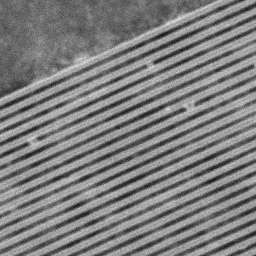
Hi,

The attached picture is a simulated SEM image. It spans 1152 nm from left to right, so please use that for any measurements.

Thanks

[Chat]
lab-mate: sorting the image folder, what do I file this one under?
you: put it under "parallel lines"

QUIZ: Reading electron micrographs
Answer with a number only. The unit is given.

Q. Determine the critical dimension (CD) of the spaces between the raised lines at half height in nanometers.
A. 26.1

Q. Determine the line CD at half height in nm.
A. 26.1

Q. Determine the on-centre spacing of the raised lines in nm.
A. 49.2